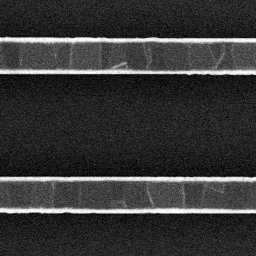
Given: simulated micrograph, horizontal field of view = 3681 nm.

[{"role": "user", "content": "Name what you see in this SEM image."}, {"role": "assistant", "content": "lines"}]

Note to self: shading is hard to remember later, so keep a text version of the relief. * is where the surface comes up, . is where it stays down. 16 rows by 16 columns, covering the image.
................
................
****************
****************
****************
................
................
................
................
................
................
****************
****************
................
................
................